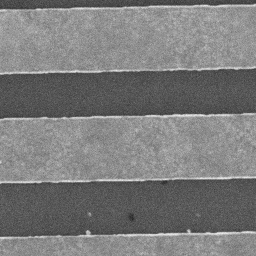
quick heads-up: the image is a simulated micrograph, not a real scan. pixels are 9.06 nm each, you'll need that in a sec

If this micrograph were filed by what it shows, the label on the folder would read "lines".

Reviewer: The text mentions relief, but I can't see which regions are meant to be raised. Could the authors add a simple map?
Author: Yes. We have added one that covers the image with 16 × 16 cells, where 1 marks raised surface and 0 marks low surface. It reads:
0000000111111111
1111111111111111
1111111111111111
1111111111111111
1110000000000000
0000000000000000
0000000000000000
1111111111111111
1111111111111111
1111111111111111
1111111111111111
0000000000000000
0000000000000000
0000000000000000
0000000000000001
1111111111111111